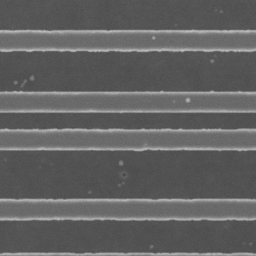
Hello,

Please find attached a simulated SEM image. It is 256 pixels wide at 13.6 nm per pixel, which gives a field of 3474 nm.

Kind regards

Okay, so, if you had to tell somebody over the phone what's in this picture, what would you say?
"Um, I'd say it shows lines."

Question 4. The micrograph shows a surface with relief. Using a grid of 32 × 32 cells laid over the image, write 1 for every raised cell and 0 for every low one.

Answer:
00000000000000000000000000000000
00000000000000000000000000000000
00000000000000000000000000000000
00000000000000000000000000000000
11111111111111111111111111111111
11111111111111111111111111111111
00000000000000000000000000000000
00000000000000000000000000000000
00000000000000000000000000000000
00000000000000000000000000000000
00000000000000000000000000000000
01100000000000000000100000100100
11111111111111111111111111111111
11111111111111111111111111111111
00000000000000000000000000000000
00000000000000000000000000000000
11111111111111111111111111111111
11111111111111111111111111111111
11111111111111111111111111111111
00000000000000000000000000000000
00000000000000000000000000000000
00000000000000000000000000000000
00000000000000000000000000000000
00000000000000000000000000000000
00000000000000000000000000000000
11111111111111111111111111111111
11111111111111111111111111111111
00000000000000000000000000000000
00000000000000000000000000000000
00000000000000000000000000000000
00000000000000000000000000000000
00000000000000000000000000000000